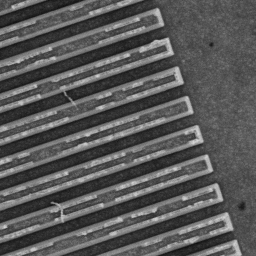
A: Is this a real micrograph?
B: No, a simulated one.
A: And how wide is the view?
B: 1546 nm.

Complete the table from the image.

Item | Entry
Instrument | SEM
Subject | parallel lines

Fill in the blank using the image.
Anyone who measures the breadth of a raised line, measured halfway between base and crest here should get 95.9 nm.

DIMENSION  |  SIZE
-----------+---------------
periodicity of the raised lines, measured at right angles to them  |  185 nanometers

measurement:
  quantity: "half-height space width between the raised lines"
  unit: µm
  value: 0.0902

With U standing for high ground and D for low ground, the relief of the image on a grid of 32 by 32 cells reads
UUUUDDDDDDUUUUUUDDDDDDDDDDDDDDDD
UDDDDDDUUUUUUDDDDDDUDDDDDDDDDDDD
DDDDUUUUUUDDDDDDUUUUDDDDDDDDDDDD
DUUUUUUDDDDDDUUUUUUDDDDDDDDDDDDD
UUUUDDDDDDUUUUUUDDDDDDDDDDDDDDDD
UDDDDDDUUUUUUDDDDDDUUDDDDDDDDDDD
DDDDUUUUUUDDDDDDUUUUUDDDDDDDDDDD
DUUUUUUDDDDDDUUUUUUDDDDDDDDDDDDD
UUUUDDDDDDUUUUUUDDDDDDDDDDDDDDDD
UDDDDDDUUUUUUDDDDDDUUUDDDDDDDDDD
DDDDUUUUUUDDDDDDUUUUUUDDDDDDDDDD
DUUUUUUDDDDDDUUUUUUDDDDDDDDDDDDD
UUUUDDDDDDUUUUUUDDDDDDUDDDDDDDDD
UDDDDDDUUUUUUDDDDDDUUUUUDDDDDDDD
DDDDUUUUUUDDDDDDUUUUUUUDDDDDDDDD
DUUUUUUDDDDDDUUUUUUUDDDDDDDDDDDD
UUUUDDDDDDUUUUUUUDDDDDDUUDDDDDDD
UDDDDDDDUUUUUUDDDDDDUUUUUDDDDDDD
DDDDDUUUUUUDDDDDDUUUUUUDDDDDDDDD
DDUUUUUUDDDDDDUUUUUUDDDDDDDDDDDD
UUUUUDDDDDDUUUUUUDDDDDDUUUDDDDDD
UUDDDDDDUUUUUUDDDDDDUUUUUUDDDDDD
DDDDDUUUUUUDDDDDDUUUUUUDDDDDDDDD
DDUUUUUUDDDDDDUUUUUUDDDDDDUDDDDD
UUUUUDDDDDDUUUUUUDDDDDDUUUUDDDDD
UUDDDDDDUUUUUUDDDDDDUUUUUUDDDDDD
DDDDDUUUUUUDDDDDDUUUUUUDDDDDDDDD
DDUUUUUUDDDDDDUUUUUUDDDDDDUUDDDD
UUUUUDDDDDDUUUUUUDDDDDDUUUUUUDDD
UUDDDDDDUUUUUUDDDDDDUUUUUUDDDDDD
DDDDDUUUUUUDDDDDDUUUUUUDDDDDDDDD
DDUUUUUUDDDDDDUUUUUUDDDDDDUUUUDD